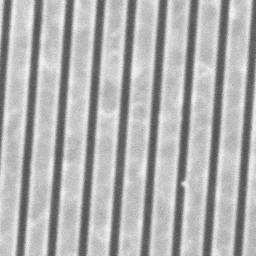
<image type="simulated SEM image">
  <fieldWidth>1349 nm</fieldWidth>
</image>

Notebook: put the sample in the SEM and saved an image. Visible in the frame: parallel lines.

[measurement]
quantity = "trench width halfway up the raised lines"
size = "60.4 nanometers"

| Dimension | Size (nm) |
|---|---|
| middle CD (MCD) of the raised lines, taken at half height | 106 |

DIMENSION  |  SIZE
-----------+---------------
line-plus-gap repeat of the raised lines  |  0.163 microns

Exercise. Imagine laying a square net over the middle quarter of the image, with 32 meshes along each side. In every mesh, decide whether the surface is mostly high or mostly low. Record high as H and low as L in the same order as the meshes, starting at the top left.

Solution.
LLHHHHLLLLHHHHLLLHHHHHLLLHHHHHLL
LLHHHHLLLHHHHHLLLHHHHHLLLHHHHHLL
LLHHHHLLLHHHHHLLLHHHHHLLLHHHHHLL
LLHHHHLLLHHHHHLLLHHHHHLLLHHHHHLL
LLHHHHLLLHHHHHLLLHHHHHLLLHHHHHLL
LHHHHHLLLHHHHHLLLHHHHHLLLHHHHHLL
LHHHHHLLLHHHHHLLLHHHHHLLLHHHHHLL
LHHHHHLLLHHHHHLLLHHHHHLLLHHHHLLL
LHHHHHLLLHHHHHLLLHHHHHLLLHHHHLLL
LHHHHHLLLHHHHHLLLHHHHHLLLHHHHLLL
LHHHHHLLLHHHHHLLLHHHHLLLLHHHHLLL
LHHHHHLLLHHHHLLLLHHHHLLLHHHHHLLL
LHHHHHLLLHHHHLLLHHHHHLLLHHHHHLLL
LHHHHHLLLHHHHLLLHHHHHLLLHHHHHLLL
LHHHHLLLLHHHHLLLHHHHHLLLHHHHHLLL
LHHHHLLLHHHHHLLLHHHHHLLLHHHHHLLL
LHHHHLLLHHHHHLLLHHHHHLLLHHHHHLLL
LHHHHLLLHHHHHLLLHHHHHLLLHHHHHLLL
LHHHHLLLHHHHHLLLHHHHHLLLHHHHHLLL
HHHHHLLLHHHHHLLLHHHHHLLLHHHHHLLL
HHHHHLLLHHHHHLLLHHHHHLLLHHHHLLLL
HHHHHLLLHHHHHLLLHHHHHLLLHHHHLLLH
HHHHHLLLHHHHHLLLHHHHHLLHHHHHLLLH
HHHHHLLLHHHHHLLLHHHHHLLHHHHHLLLH
HHHHHLLLHHHHLLLLHHHHLLLHHHHHLLLH
HHHHHLLLHHHHLLLLHHHHLLLHHHHHLLLH
HHHHHLLLHHHHLLLLHHHHLLLHHHHHLLLH
HHHHHLLLHHHHLLLLHHHHLLLHHHHHLLLH
HHHHLLLLHHHHLLLHHHHHLLLHHHHHLLLH
HHHHLLLHHHHHLLLHHHHHLLLHHHHHLLHH
HHHHLLLHHHHHLLLHHHHHLLLHHHHHLLHH
HHHHLLLHHHHHLLLHHHHHLLLHHHHLLLLH